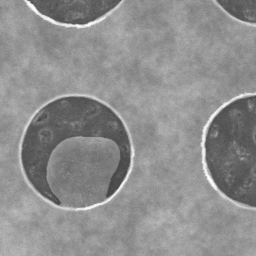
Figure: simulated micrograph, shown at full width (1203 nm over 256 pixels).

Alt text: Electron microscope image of holes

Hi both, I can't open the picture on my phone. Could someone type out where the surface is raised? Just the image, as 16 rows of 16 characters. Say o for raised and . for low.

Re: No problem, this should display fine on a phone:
oo.....ooooooo..
oooo.ooooooooooo
oooooooooooooooo
oooooooooooooooo
oooooooooooooooo
oooooooooooooooo
ooo...oooooooo..
oo......ooooo...
oo......ooooo...
o.......ooooo...
o.......ooooo...
oo......ooooo...
ooo....oooooooo.
oooooooooooooooo
oooooooooooooooo
oooooooooooooooo